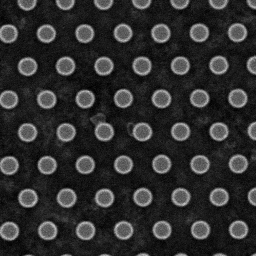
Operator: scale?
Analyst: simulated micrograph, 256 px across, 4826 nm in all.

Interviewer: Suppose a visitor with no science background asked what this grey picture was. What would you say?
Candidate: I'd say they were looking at a regular array of raised bodies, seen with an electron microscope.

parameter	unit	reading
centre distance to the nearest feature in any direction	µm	0.711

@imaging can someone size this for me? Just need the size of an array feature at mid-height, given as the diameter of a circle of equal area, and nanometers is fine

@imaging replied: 340